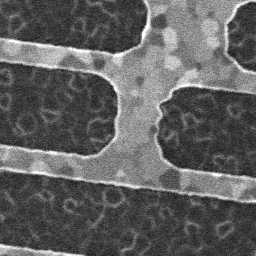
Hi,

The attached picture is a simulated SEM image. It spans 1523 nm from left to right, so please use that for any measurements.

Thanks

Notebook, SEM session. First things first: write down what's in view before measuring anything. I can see one or a few lines or trenches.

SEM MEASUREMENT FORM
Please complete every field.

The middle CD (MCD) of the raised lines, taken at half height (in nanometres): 140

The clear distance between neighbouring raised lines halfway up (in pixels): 83.1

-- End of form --